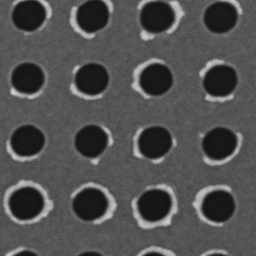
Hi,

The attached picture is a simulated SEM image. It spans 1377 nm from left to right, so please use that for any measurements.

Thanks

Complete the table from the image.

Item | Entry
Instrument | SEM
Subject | a regular array of holes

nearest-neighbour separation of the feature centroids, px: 62.6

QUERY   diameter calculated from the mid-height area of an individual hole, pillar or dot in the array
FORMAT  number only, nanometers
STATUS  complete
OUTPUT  174